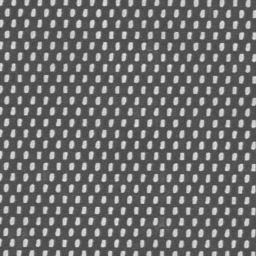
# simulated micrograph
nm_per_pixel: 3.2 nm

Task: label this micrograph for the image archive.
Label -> a regular array of raised bodies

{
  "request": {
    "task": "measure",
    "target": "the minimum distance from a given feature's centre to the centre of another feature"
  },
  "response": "39.8 nanometres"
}